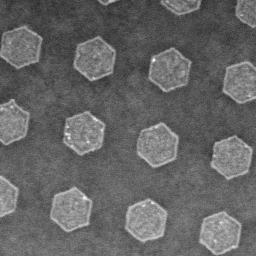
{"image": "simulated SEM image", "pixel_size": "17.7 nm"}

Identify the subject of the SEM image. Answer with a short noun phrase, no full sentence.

a regular array of raised bodies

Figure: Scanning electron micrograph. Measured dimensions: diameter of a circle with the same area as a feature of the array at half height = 693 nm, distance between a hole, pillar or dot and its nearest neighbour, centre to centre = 1330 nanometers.